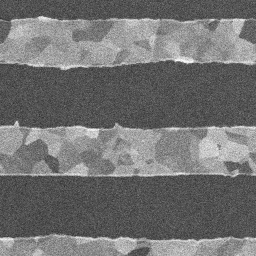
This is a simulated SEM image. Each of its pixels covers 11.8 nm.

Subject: one or a few lines or trenches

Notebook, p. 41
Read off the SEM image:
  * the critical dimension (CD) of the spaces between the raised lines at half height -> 760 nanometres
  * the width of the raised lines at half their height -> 45.3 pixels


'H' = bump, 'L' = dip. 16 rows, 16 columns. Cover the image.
LLLLLLLLLLLLLLLL
HHHHHHHHHHHHHHHH
HHHHHHHHHHHHHHHH
HHHHHHHHHHHHHHHH
LLLLLLLLLLLLLLLL
LLLLLLLLLLLLLLLL
LLLLLLLLLLLLLLLL
LLLLLLLLLLLLLLLL
HHHHHHHHHHHHHHHH
HHHHHHHHHHHHHHHH
HHHHHHHHHHHHHHHH
LLLLLLLLLLLLLLLL
LLLLLLLLLLLLLLLL
LLLLLLLLLLLLLLLL
LLLLLLLLLLLLLLLL
HHHHHHHHHHHHHHHH